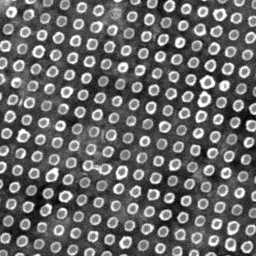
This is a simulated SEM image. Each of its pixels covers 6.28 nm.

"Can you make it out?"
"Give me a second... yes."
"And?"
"a regular array of raised bodies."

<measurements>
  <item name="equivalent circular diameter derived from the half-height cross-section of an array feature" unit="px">10.1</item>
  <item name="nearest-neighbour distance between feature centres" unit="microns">0.106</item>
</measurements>